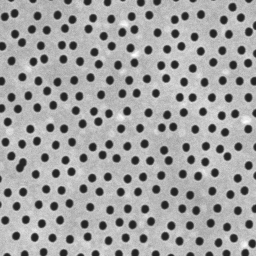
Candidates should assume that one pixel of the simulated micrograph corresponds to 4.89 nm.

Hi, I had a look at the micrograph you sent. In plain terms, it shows a regular array of holes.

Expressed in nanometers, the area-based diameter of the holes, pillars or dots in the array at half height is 42.4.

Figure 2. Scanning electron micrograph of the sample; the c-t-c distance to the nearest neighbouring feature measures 71.6 nm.